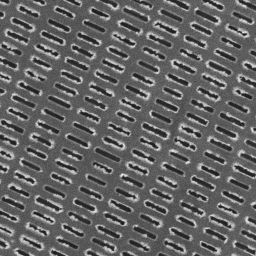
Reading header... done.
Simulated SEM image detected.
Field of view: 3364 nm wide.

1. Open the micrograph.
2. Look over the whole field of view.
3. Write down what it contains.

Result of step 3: a regular array of holes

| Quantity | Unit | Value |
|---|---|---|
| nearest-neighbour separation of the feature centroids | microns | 0.181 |